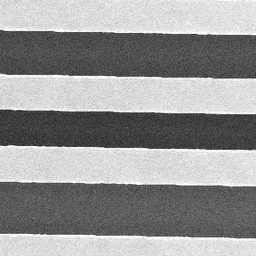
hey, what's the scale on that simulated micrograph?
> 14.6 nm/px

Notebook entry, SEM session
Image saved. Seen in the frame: lines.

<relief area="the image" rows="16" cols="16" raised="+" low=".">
++++++++++++++++
++++++++++++++++
................
................
................
++++++++++++++++
++++++++++++++++
................
................
++++++++++++++++
++++++++++++++++
...........+++++
................
................
................
++++++++++++++++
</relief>